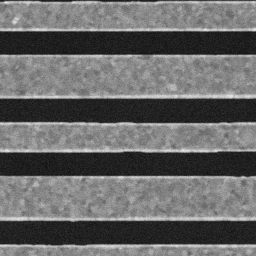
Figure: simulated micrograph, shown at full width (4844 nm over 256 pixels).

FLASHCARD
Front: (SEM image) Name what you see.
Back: lines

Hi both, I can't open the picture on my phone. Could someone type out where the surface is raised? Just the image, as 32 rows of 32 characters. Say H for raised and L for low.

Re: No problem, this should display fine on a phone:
HHHHHHHHHHHHHHHHHHHHHHHHHHHHHHHH
HHHHHHHHHHHHHHHHHHHHHHHHHHHHHHHH
HHHHHHHHHHHHHHHHHHHHHHHHHHHHHHHH
HHHHHHHHHHHHHHHHHHHHHHHHHHHHHHHH
LLLLLLLLLLLLLLLLLLLLLLLLLLLLLLLL
LLLLLLLLLLLLLLLLLLLLLLLLLLLLLLLL
LLLLLLLLLLLLLLLLLLLLLLLLLLLLLLLL
HHHHHHHHHHHHHHHHHHHHHHHHHHHHHHHH
HHHHHHHHHHHHHHHHHHHHHHHHHHHHHHHH
HHHHHHHHHHHHHHHHHHHHHHHHHHHHHHHH
HHHHHHHHHHHHHHHHHHHHHHHHHHHHHHHH
HHHHHHHHHHHHHHHHHHHHHHHHHHHHHHHH
LLLLLLLLLLLLLLLLLLLLLLLLLLLLLLLL
LLLLLLLLLLLLLLLLLLLLLLLLLLLLLLLL
LLLLLLLLLLLLLLLLLLLLLLLLLLLLLLLL
HHHHHHHHHHHHHHHHHHHHHHHHHHHHHHHH
HHHHHHHHHHHHHHHHHHHHHHHHHHHHHHHH
HHHHHHHHHHHHHHHHHHHHHHHHHHHHHHHH
HHHHHHHHHHHHHHHHHHHHHHHHHHHHHHHH
LLLLLLLLLLLLLLLLLLLLLLLLLLLLLLLL
LLLLLLLLLLLLLLLLLLLLLLLLLLLLLLLL
LLLLLLLLLLLLLLLLLLLLLLLLLLLLLLLL
HHHHHHHHHHHHHHHHHHHHHHHHHHHHHHHH
HHHHHHHHHHHHHHHHHHHHHHHHHHHHHHHH
HHHHHHHHHHHHHHHHHHHHHHHHHHHHHHHH
HHHHHHHHHHHHHHHHHHHHHHHHHHHHHHHH
HHHHHHHHHHHHHHHHHHHHHHHHHHHHHHHH
LLLLLLLLLLLLLLLLLLLLLLLLLLLLLLLL
LLLLLLLLLLLLLLLLLLLLLLLLLLLLLLLL
LLLLLLLLLLLLLLLLLLLLLLLLLLLLLLLL
LLLLLLLLLLLLLLLLLLLLLLLLLLLLLLLL
HHHHHHHHHHHHHHHHHHHHHHHHHHHHHHHH